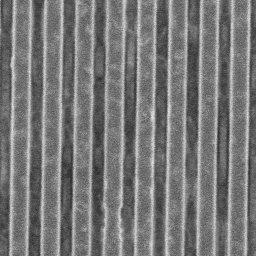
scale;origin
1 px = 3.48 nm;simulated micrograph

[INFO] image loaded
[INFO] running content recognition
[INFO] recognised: parallel lines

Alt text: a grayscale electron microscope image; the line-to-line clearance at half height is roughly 46.1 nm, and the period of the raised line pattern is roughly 0.108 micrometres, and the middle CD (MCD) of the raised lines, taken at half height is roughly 0.0621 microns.